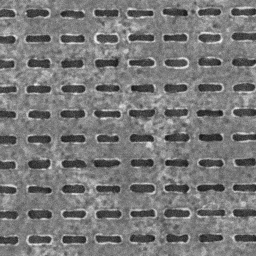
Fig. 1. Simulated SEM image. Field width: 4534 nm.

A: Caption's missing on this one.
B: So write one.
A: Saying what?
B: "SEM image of a regular array of holes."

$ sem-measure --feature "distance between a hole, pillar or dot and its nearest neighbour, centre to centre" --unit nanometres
440